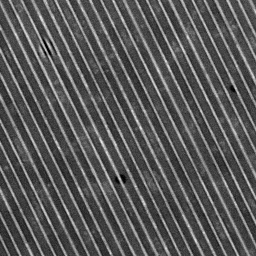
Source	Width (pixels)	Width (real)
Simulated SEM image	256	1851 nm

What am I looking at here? parallel lines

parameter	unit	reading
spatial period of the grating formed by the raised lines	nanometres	74.3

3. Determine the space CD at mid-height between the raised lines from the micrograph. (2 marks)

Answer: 61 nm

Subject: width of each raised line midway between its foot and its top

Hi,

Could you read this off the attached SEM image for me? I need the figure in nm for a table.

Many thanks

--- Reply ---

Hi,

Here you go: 12.2